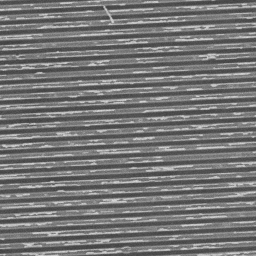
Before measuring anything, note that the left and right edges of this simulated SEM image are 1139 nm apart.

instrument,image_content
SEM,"parallel lines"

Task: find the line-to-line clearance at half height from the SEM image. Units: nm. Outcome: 19.4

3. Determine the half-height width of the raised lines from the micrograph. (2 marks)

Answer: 23.3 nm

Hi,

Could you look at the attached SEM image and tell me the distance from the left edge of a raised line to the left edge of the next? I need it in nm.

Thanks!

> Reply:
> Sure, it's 44.1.